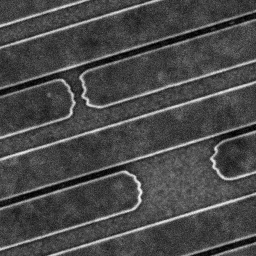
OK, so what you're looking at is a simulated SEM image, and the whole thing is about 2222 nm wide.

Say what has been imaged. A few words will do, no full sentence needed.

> parallel lines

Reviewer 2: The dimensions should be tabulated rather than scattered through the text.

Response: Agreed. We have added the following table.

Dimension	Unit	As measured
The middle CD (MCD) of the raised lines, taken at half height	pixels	39.5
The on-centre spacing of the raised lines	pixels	53.8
